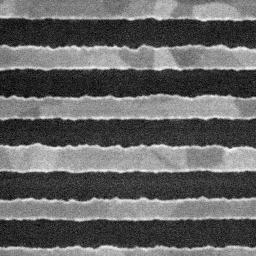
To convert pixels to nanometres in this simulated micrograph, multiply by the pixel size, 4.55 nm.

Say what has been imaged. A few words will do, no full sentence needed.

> lines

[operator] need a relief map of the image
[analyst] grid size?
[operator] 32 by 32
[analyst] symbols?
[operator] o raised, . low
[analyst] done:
oooooooooooooooooooooooooooooooo
oooooooooooooooooooooooooooooooo
.........................o...o..
................................
................................
................................
oooooooooooooooooooooooooooooooo
oooooooooooooooooooooooooooooooo
ooo.oooooooooooooooooooo.ooooooo
................................
................................
................................
oooooooooooooooooooooooooooooooo
oooooooooooooooooooooooooooooooo
oooooooooooooooooooooooooooooooo
................................
................................
................................
oooooooooooooooooooooooooooo.ooo
oooooooooooooooooooooooooooooooo
oooooooooooooooooooooooooooooooo
..oo.o...oo...oo...o............
................................
................................
................................
oooooooooooooooooooooooooooooooo
oooooooooooooooooooooooooooooooo
.........oo.....o...............
................................
................................
................................
oooooooooooooooooooooooooooooooo